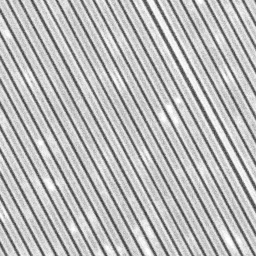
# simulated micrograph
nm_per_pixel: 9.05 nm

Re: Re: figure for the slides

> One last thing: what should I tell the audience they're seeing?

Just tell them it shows parallel lines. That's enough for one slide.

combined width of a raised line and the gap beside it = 99.1 nm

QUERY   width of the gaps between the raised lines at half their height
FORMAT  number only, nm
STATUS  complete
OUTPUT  31.9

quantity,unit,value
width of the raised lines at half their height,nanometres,63.9